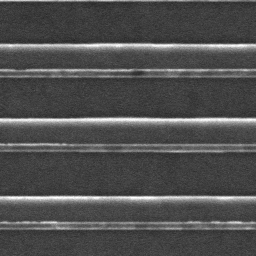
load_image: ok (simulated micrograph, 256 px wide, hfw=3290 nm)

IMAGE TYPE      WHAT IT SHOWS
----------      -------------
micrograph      lines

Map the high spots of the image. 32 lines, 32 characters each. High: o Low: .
................................
................................
................................
................................
................................
................................
oooooooooooooooooooooooooooooooo
oooooooooooooooooooooooooooooooo
oooooooooooooooooooooooooooooooo
oooooooooooooooooooooooooooooooo
................................
................................
................................
................................
................................
oooooooooooooooooooooooooooooooo
oooooooooooooooooooooooooooooooo
oooooooooooooooooooooooooooooooo
oooooooooooooooooooooooooooooooo
................................
................................
................................
................................
................................
................................
oooooooooooooooooooooooooooooooo
oooooooooooooooooooooooooooooooo
oooooooooooooooooooooooooooooooo
oooooooooooooooooooooooooooooooo
................................
................................
................................